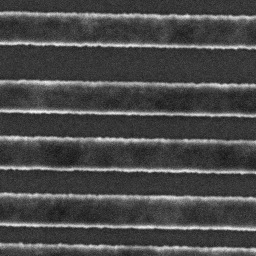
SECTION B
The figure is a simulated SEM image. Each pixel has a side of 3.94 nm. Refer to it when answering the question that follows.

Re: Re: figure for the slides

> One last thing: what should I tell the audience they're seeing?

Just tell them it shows lines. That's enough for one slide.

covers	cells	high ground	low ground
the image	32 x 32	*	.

................................
................................
********************************
********************************
********************************
**.*****************************
................................
................................
................................
................................
******************.*............
********************************
********************************
********************************
..........................*..***
................................
................................
*********************...........
********************************
********************************
********************************
.........................*******
................................
................................
*********.......................
********************************
********************************
********************************
..................**************
................................
................................
********************************